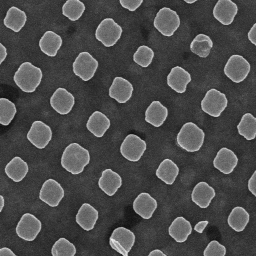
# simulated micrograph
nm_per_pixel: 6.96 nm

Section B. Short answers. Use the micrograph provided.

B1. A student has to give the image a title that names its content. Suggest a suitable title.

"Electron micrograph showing a regular array of raised bodies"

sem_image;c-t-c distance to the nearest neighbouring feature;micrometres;0.285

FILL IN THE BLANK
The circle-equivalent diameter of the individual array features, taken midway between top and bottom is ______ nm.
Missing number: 164